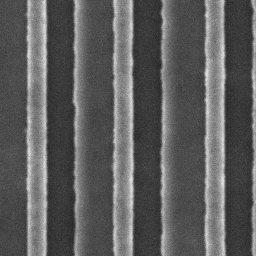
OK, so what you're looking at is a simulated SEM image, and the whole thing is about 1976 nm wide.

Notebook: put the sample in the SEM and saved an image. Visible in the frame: lines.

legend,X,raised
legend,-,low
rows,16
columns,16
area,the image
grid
XXX--XXX--XXXX--
XXX--XXX--XXXX--
XXX--XXX--XXXX--
XXX--XXX--XXXX--
XXX--XXX--XXXX--
XXX--XXX--XXXX--
XXX--XXX--XXXX--
XXX--XXX--XXXX--
XXX--XXX--XXXX--
XXX--XXX--XXXX--
XXX--XXX--XXXX--
XXX--XXX--XXXX--
XXX--XXX--XXXX--
XXX--XXX--XXXX--
XXX--XXX--XXXX--
XXX--XXX--XXXX--